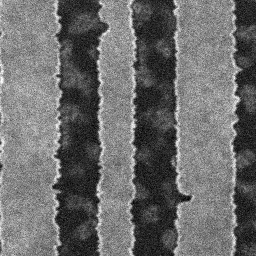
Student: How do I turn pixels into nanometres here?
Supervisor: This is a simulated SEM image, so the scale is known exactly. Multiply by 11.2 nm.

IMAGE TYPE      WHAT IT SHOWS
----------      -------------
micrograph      one or a few lines or trenches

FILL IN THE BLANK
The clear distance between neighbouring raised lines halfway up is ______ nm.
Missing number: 484